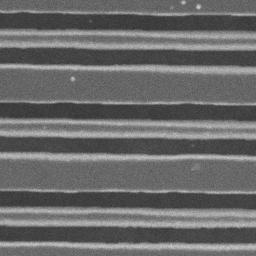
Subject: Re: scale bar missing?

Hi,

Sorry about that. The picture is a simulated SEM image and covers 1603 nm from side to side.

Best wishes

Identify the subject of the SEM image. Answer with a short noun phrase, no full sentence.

lines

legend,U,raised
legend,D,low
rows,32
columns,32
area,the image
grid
UUUUUUUUUUUUUUUUUUUUUUUUUUUUUUUU
UUUUUUUUUUUUUUUUUUUUUUUUUUUUUUUU
DDDDDDDDDDDDDDDDDDDDDDDDDDDDDDDD
DDDDDDDDDDDDDDDDDDDDDDDDDDDDDDDD
UUUUUUUUUUUUUUUUUUUUUUUUUUUUUUUU
UUUUUUUUUUUUUUUUUUUUUUUUUUUUUUUU
DDDDDDDDDDDDDDDDDDDDDDDDDDDDDDDD
DDDDDDDDDDDDDDDDDDDDDDDDDDDDDDDD
UUUUUUUUUUUUUUUUUUUUUUUUUUUUUUUU
UUUUUUUUUUUUUUUUUUUUUUUUUUUUUUUU
UUUUUUUUUUUUUUUUUUUUUUUUUUUUUUUU
UUUUUUUUUUUUUUUUUUUUUUUUUUUUUUUU
UUUUUUUUUUUUUUUUUUUUUUUUUUUUUUUU
DDDDDDDDDDDDDDDDDDDDDDDDDDDDDDDD
DDDDDDDDDDDDDDDDDDDDDDDDDDDDDDDD
UUUUUUUUUUUUUUUUUUUUUUUUUUUUUUUU
UUUUUUUUUUUUUUUUUUUUUUUUUUUUUUUU
DDDDDDDDDDDDDDDDDDDDDDDDDDDDDDDD
DDDDDDDDDDDDDDDDDDDDDDDDDDDDDDDD
UUUUUUUUUUUUUUUUUUUDDDUUUUUUDDDD
UUUUUUUUUUUUUUUUUUUUUUUUUUUUUUUU
UUUUUUUUUUUUUUUUUUUUUUUUUUUUUUUU
UUUUUUUUUUUUUUUUUUUUUUUUUUUUUUUU
UUUUUUUUUUUUUUUUUUUUUUUUUUUUUUUU
DDDDDDDDDDDDDDDDDDDDDDDDDDDDDDDD
DDDDDDDDDDDDDDDDDDDDDDDDDDDDDDDD
UUUUUUUUUUUUUUUUUUUUUUUUUUUUUUUU
UUUUUUUUUUUUUUUUUUUUUUUUUUUUUUUU
DDDDDDDDDDDDDDDDDDDDDDDDDDDDDDDD
DDDDDDDDDDDDDDDDDDDDDDDDDDDDDDDD
UUUUUUUUUUUUUDDUDDUDUUUDDDDDDDDD
UUUUUUUUUUUUUUUUUUUUUUUUUUUUUUUU